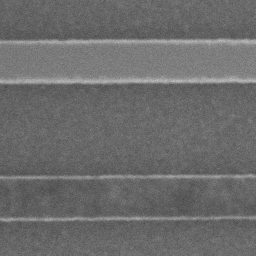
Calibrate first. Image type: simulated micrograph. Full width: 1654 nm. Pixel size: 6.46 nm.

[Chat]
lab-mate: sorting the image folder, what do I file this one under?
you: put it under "lines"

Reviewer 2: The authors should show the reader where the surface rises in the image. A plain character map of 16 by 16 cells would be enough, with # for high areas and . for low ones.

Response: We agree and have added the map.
................
................
................
################
################
................
................
................
................
................
................
################
################
################
................
................